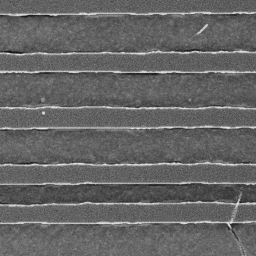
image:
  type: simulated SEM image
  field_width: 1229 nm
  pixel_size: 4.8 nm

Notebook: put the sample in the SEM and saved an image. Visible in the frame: lines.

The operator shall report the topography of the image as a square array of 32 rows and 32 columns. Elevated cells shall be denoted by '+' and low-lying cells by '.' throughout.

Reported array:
++++++++++++++++++++++++++++++++
++++++++++++++++++++++++++++++++
................................
................................
................................
................................
...................+++..+..++++.
++++++++++++++++++++++++++++++++
++++++++++++++++++++++++++++++++
................................
................................
................................
................................
+++++++++++++++++++++++++++++++.
++++++++++++++++++++++++++++++++
++++++++++++++++++++++++++++++++
................................
................................
................................
................................
........+++........++++.++++....
++++++++++++++++++++++++++++++++
++++++++++++++++++++++++++++++++
................................
................................
......+...++++++++++++++++++++++
++++++++++++++++++++++++++++++++
++++++++++++++++++++++++++++++++
................................
................................
................................
................................